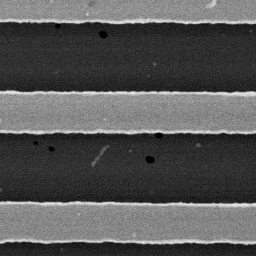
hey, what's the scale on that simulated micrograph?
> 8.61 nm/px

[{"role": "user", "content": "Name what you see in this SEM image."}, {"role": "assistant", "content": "lines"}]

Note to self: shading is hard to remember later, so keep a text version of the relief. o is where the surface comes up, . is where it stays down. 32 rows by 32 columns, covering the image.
oooooooooooooooooooooooooooooooo
oooooooooooooooooooooooooooooooo
oooooooooooooooooooooooooooooooo
................................
................................
................................
................................
................................
................................
................................
................................
................................
oooooooooooooooooooooooooooooooo
oooooooooooooooooooooooooooooooo
oooooooooooooooooooooooooooooooo
oooooooooooooooooooooooooooooooo
oooooooooooooooooooooooooooooooo
................................
................................
................................
................................
................................
................................
................................
................................
oooooooooooooooo.....oo.........
oooooooooooooooooooooooooooooooo
oooooooooooooooooooooooooooooooo
oooooooooooooooooooooooooooooooo
oooooooooooooooooooooooooooooooo
................................
................................